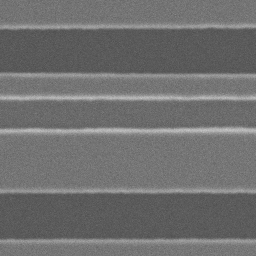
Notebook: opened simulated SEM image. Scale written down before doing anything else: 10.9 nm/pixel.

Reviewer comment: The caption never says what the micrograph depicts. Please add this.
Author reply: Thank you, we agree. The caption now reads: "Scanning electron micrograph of lines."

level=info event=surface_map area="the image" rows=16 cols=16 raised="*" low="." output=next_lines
****************
****************
................
................
................
****************
****************
****************
****************
****************
****************
****************
................
................
................
****************